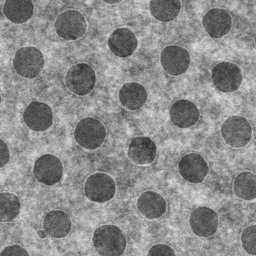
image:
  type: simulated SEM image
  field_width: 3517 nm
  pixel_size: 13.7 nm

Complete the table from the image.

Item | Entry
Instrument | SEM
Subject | a regular array of raised bodies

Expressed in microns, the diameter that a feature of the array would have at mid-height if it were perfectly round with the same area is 0.436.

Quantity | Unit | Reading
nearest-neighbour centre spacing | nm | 746